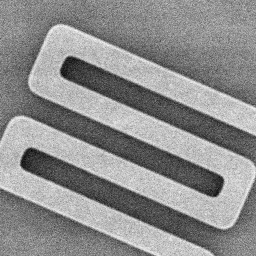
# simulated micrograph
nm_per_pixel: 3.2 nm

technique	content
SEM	groups of lines, slits or small figures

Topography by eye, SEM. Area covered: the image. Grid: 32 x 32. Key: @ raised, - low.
--------------------------------
--------------------------------
--------------------------------
-------@@-----------------------
------@@@@@---------------------
-----@@@@@@@@@------------------
-----@@@@@@@@@@@----------------
-----@@@--@@@@@@@@--------------
----@@@@-----@@@@@@@@-----------
----@@@@-------@@@@@@@@---------
----@@@@@--------@@@@@@@@-------
----@@@@@@@@--------@@@@@@@-----
------@@@@@@@@--------@@@@@@@@--
--------@@@@@@@@--------@@@@@@@@
-----------@@@@@@@@-------@@@@@@
-@@@@--------@@@@@@@@--------@@@
-@@@@@@@-------@@@@@@@@--------@
@@@@@@@@@@--------@@@@@@@@------
@@@@@@@@@@@@--------@@@@@@@@----
@@@----@@@@@@@--------@@@@@@@@--
@@@------@@@@@@@@--------@@@@@@@
@@@--------@@@@@@@@--------@@@@@
@@@@@@-------@@@@@@@@-------@@@@
@@@@@@@@--------@@@@@@@@----@@@-
---@@@@@@@--------@@@@@@@@-@@@@-
-----@@@@@@@@-------@@@@@@@@@@--
-------@@@@@@@@--------@@@@@@@--
---------@@@@@@@@--------@@@@---
------------@@@@@@@--------@----
--------------@@@@@@@@----------
----------------@@@@@@@@--------
-------------------@@@@@@@------